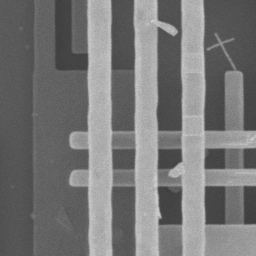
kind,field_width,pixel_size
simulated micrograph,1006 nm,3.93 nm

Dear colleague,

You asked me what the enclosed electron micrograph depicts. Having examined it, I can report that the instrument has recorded wiring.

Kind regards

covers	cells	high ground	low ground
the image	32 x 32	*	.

...........***...***...**.......
...........***...***...***......
...........***...***...***......
...........***...*****.***......
...........***...***...***......
...........***...***...**.......
...........***...***...**.......
...........***...***...***......
...........***...***...***......
...........***...***...***......
...........***...***...***......
...........***...***...***......
...........***...***...***......
...........***...***...***......
...........***...***...***......
...........***...***...***......
...........*********************
.........***********************
.........***********************
...........***...***...***......
...........***...***..****......
.........***********************
.........***********************
...........***...***...***......
...........***...***...***......
...........***...***...***......
...........***...***...***......
...........***...***...***......
...........***...***************
...........***...***************
...........***...***************
...........***...***************